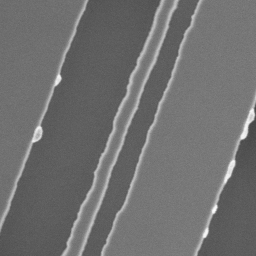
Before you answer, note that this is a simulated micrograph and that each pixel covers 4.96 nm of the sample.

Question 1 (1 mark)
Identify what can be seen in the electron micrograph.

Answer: lines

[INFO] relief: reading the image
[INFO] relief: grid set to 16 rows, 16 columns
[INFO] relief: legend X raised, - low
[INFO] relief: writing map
XXXXX-----XXXXXX
XXXXX-----XXXXXX
XXXX-----XXXXXXX
XXXX-----XXXXXXX
XXXX----XXXXXXXX
XXX-----XXXXXXXX
XXX-----XXXXXXXX
XXX----XXXXXXXXX
XXX----XXXXXXXX-
XX----XXXXXXXXX-
X-----XXXXXXXXX-
X-----XXXXXXXX--
X----XXXXXXXXX--
-----XXXXXXXX---
----XXXXXXXXX---
----XXXXXXXX----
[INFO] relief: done